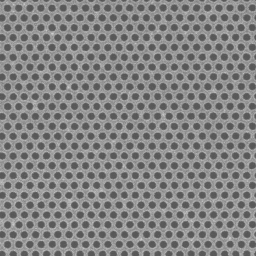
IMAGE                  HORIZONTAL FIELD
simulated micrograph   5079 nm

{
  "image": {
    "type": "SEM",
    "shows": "a regular array of holes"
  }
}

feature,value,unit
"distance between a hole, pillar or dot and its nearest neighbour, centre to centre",216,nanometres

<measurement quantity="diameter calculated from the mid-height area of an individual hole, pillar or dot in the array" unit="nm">148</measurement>